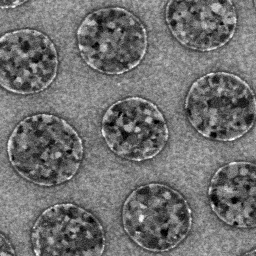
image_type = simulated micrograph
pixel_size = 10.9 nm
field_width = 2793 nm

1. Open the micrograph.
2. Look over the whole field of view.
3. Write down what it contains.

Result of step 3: raised bodies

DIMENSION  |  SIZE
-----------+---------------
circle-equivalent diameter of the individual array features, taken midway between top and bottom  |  725 nm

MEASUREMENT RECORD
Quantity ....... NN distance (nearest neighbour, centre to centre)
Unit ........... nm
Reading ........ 994